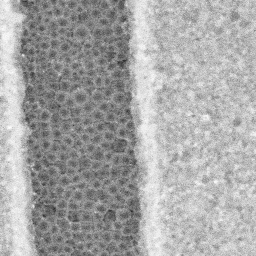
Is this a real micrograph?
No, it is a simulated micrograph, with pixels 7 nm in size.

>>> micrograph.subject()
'one or a few lines or trenches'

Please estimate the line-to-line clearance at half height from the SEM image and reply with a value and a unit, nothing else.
0.927 micrometres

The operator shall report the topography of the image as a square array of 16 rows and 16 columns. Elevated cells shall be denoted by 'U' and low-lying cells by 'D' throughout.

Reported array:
DDDDDDDDDUUUUUUU
UDDDDDDDDUUUUUUU
DDDDDDDDDUUUUUUU
UDDDDDDDDUUUUUUU
UDDDDDDDDUUUUUUU
UDDDDDDDDUUUUUUU
UDDDDDDDDUUUUUUU
UDDDDDDDDUUUUUUU
UDDDDDDDDUUUUUUU
UDDDDDDDDUUUUUUU
UDDDDDDDDDUUUUUU
UDDDDDDDDDUUUUUU
UDDDDDDDDUUUUUUU
UDDDDDDDDUUUUUUU
UDDDDDDDDDUUUUUU
UDDDDDDDDDUUUUUU